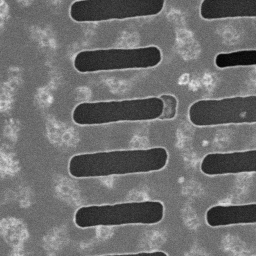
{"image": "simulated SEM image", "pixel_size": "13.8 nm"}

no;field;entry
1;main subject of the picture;holes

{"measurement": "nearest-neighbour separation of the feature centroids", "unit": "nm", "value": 720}